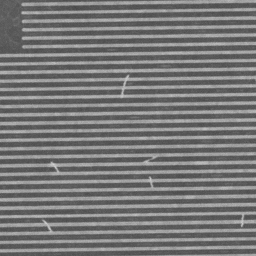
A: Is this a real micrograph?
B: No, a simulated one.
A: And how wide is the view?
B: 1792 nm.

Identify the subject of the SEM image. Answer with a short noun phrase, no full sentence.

parallel lines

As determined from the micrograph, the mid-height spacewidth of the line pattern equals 41.1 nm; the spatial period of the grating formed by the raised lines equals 59.4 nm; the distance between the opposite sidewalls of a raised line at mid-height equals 2.87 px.